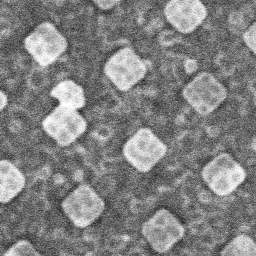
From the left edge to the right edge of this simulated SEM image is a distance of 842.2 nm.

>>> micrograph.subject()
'a regular array of raised bodies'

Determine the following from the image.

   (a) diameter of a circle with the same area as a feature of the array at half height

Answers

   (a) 123 nm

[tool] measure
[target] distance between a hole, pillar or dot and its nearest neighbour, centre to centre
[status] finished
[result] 271 nm